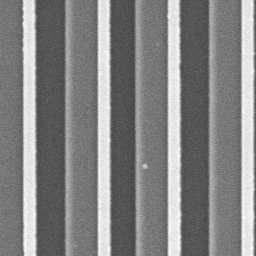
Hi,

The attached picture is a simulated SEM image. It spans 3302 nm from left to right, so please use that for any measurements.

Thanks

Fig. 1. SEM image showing lines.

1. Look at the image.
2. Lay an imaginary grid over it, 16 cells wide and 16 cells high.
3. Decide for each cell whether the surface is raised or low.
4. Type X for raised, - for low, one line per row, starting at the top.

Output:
XX--XXX--XX--XXX
XX--XXX--XX--XXX
XX--XXX--XX--XXX
XX--XXX--XX--XXX
XX--XXX--XX--XXX
XX--XXX--XX--XXX
XX--XXX--XX--XXX
XX--XXX--XX--XXX
XX--XXX--XX--XXX
XX--XXX--XX--XXX
XX--XXX--XX--XXX
XX--XXX--XX--XXX
XX--XXX--XX--XXX
XX--XXX--XX--XXX
XX--XXX--XX--XXX
XX--XXX--XX--XXX